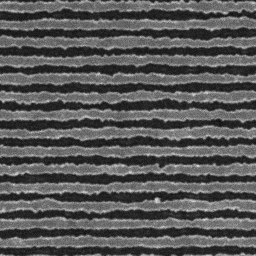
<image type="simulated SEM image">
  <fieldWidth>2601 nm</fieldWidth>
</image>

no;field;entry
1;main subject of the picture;parallel lines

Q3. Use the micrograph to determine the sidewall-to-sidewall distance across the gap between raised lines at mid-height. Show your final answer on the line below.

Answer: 0.0953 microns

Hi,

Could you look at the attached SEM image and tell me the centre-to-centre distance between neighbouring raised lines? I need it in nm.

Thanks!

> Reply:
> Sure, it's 184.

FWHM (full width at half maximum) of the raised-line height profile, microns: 0.0953